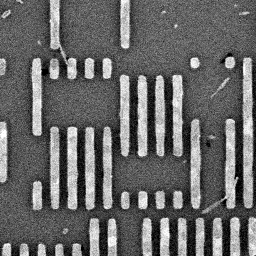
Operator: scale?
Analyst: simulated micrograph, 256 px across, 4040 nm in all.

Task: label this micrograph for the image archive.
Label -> wiring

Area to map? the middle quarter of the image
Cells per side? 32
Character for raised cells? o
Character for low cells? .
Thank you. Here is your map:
.oo..oo...oo....................
.oo..oo...oo....................
.oo..oo...oo....................
.oo...........oo...o...oo..oo...
..............oo...oo..oo..oo...
..............oo...oo..oo..oo...
..............oo...oo..oo..oo...
..............oo...oo..oo..oo...
..............oo...oo..oo..oo...
..............oo...oo..oo..oo...
..............oo...oo..oo..oo...
..............oo...oo..oo..oo...
..............oo...oo..oo..oo...
..............oo...oo..oo..oo...
..............oo...oo..oo..oo...
..............oo...oo..oo..oo...
.oo..oo...oo..oo...oo..oo..oo...
.oo..oo...oo..oo...oo..oo..oo...
.oo..oo...oo..oo...oo..oo..oo...
.oo..oo...oo..oo...oo..oo..oo...
.oo..oo...oo..oo...oo..oo..oo...
.oo..oo...oo..oo...oo..oo..oo...
.oo..oo...oo...o...oo...o...o...
.oo..oo...oo....................
.oo..oo...oo....................
.oo..oo...oo....................
.oo..oo...oo....................
.oo..oo...oo....................
.oo..oo...oo....................
.oo..oo...oo....................
.oo..oo...oo....................
.oo...o...oo....................